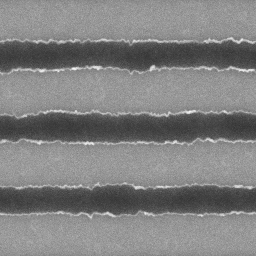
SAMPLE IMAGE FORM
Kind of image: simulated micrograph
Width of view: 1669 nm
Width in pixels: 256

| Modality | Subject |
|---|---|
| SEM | one or a few lines or trenches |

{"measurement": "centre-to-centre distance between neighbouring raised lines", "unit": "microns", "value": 0.472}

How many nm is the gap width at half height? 282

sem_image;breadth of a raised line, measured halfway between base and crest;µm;0.187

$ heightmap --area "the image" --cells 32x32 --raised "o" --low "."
................................
................................
................................
................................
................................
oooooooooooooooooooooooooooooooo
oooooooooooooooooooooooooooooooo
oooooooooooooooooooooooooooooooo
oooooooooooooooooooooooooooooooo
................................
................................
................................
................................
................................
oo.ooooooooooooooooooooooooooooo
oooooooooooooooooooooooooooooooo
oooooooooooooooooooooooooooooooo
oooooooooooooooooooooooooooooooo
................................
................................
................................
................................
................................
oooooooooooooooooooooooooooooooo
oooooooooooooooooooooooooooooooo
oooooooooooooooooooooooooooooooo
oooooooooooooooooooooooooooooooo
................................
................................
................................
................................
................................